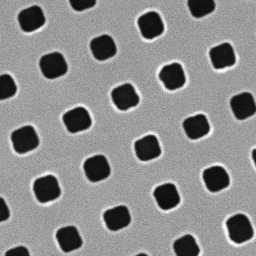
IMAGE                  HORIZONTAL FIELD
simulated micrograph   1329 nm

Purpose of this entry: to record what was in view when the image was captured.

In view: a regular array of holes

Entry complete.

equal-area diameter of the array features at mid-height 136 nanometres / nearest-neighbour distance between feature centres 0.272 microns